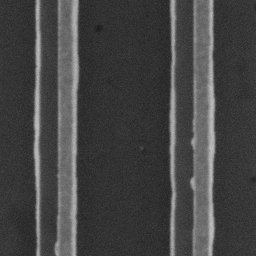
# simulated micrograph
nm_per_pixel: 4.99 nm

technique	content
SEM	lines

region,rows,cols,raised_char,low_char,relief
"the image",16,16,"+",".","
..+++......++...
..+++......++...
..+++......++...
..+++......++...
..+++......++...
..+++......++...
..+++......++...
..+++......++...
..+++......++...
..+++......++...
..+++......++...
..+++......++...
..+++......++...
..+++......++...
..+++......++...
..+++......++...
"